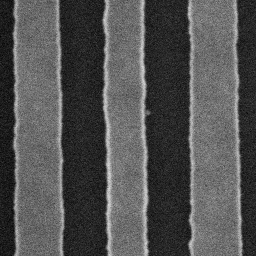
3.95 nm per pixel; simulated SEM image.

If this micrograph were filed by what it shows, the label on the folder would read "lines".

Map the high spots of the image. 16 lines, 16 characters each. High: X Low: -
-XXX---XX---XXX-
-XXX---XX---XXX-
-XXX---XX---XXX-
-XXX---XX---XXX-
-XXX---XX---XXX-
-XXX---XX---XXX-
-XXX---XX---XXX-
-XXX---XX---XXX-
-XXX---XX---XXX-
-XXX---XX---XXX-
-XXX---XX---XXX-
-XXX---XX---XXX-
-XXX---XX---XXX-
-XXX---XX---XXX-
-XXX---XX---XXX-
-XXX---XX---XXX-